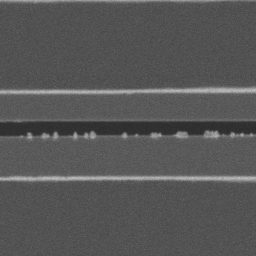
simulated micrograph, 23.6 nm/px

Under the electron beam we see lines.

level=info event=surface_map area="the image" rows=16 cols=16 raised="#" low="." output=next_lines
................
................
................
................
................
................
################
################
.###.#.#########
################
################
................
................
................
................
................